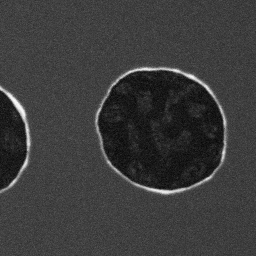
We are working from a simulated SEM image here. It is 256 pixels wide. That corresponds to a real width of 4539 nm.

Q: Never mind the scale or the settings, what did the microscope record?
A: holes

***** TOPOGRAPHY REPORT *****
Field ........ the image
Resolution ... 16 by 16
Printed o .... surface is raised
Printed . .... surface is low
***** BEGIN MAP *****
oooooooooooooooo
oooooooooooooooo
oooooooooooooooo
oooooooooooooooo
oooooooo...ooooo
ooooooo......ooo
.ooooo........oo
..oooo........oo
..oooo........oo
..ooooo.......oo
.oooooo.......oo
.oooooooo...oooo
oooooooooooooooo
oooooooooooooooo
oooooooooooooooo
oooooooooooooooo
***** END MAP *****